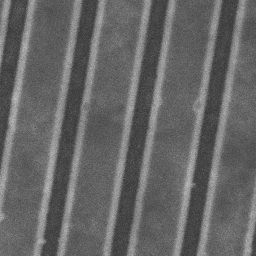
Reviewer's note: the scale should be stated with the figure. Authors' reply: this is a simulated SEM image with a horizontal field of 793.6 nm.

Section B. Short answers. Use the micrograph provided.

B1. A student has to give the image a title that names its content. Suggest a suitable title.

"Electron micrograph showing one or a few lines or trenches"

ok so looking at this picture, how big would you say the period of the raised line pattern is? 214 nm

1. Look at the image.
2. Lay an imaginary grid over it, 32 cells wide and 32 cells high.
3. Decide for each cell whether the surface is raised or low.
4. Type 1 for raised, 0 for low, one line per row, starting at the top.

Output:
10001111110001111110011111100011
10001111110011111100011111100011
10001111110011111100011111100011
10011111100011111100011111100011
00011111100011111100011111100111
00011111100011111100011111100111
00011111100011111100111111000111
00011111100011111000111111000111
00011111100111111000111111000111
00111111000111111000111111000111
00111111000111111000111111000111
00111111000111111000111111001111
00111111000111111001111110001111
00111111001111110001111110001111
00111111001111110001111110001111
01111110001111110001111110001111
01111110001111110001111110001111
01111110001111110001111110011111
01111110001111110011111100011111
01111110001111100011111100011111
01111110011111100011111100011111
11111100011111100011111100011111
11111100011111100011111100011111
11111100011111100011111100111111
11111100011111100111111000111111
11111100011111000111111000111111
11111100111111000111111000111111
11111000111111000111111000111111
11111000111111000111111000111111
11111000111111000111111001111110
11111000111111001111110001111110
11111000111110001111110001111110